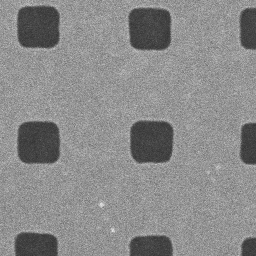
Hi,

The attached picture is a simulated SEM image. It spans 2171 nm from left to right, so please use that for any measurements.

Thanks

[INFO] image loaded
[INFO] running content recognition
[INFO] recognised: holes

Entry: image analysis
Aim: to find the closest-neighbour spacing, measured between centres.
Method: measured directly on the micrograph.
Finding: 950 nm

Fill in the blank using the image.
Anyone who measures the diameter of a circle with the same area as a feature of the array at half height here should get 395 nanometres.